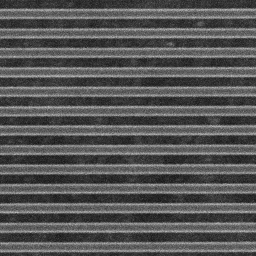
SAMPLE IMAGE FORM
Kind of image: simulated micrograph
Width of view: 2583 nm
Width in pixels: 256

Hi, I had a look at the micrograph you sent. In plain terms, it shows parallel lines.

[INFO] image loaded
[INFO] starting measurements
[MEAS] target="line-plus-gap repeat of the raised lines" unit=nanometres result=196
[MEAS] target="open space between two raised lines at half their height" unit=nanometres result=106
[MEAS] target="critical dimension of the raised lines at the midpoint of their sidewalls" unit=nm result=87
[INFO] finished